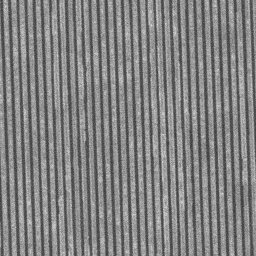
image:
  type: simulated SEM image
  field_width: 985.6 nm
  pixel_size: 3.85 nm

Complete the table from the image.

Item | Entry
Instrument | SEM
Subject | parallel lines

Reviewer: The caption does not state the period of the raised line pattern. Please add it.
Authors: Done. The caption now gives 31 nanometers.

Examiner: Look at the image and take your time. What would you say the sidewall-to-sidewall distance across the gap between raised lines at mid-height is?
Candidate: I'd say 14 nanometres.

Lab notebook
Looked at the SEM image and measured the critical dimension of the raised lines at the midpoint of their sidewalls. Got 17.3 nanometers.